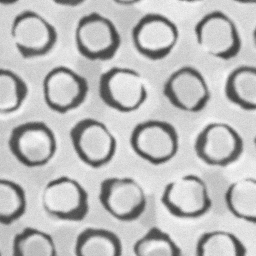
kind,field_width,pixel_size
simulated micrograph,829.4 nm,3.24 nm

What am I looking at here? ring-shaped grooves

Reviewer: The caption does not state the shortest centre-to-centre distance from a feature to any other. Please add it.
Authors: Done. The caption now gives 0.201 micrometres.